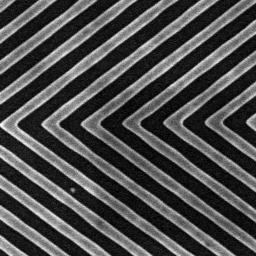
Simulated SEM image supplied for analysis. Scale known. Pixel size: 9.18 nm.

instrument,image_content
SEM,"groups of lines, slits or small figures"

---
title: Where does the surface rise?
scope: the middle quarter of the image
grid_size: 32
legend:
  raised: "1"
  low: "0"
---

00011110000001111000000111100000
01111000000111110000001111000000
11110000001111000000111100000011
11100000011110000001111000000111
10000000111100000011110000001111
00000011110000000111000000111110
00000111100000011110000001111000
00001111000000111100000011110000
00111110000011111000000111100000
01111000000111110000011111000001
11110000001111000000111100000011
11100000011110000001111000000111
11000000111100000111110000011111
00000011110000001111000000111110
00000111100000011110000001111100
00000111100000011110000001111100
00000011111000000111100000011110
11000001111100000011110000001111
11100000011110000001111100000111
11110000001111100000011110000001
01111000000111110000001111000000
00111110000001111000000111110000
00001111000000111110000011111000
00000111100000011111000000111100
00000001111000000111100000011110
11000000111100000011111000000111
11100000011110000001111100000011
11111000001111100000011110000001
01111100000011110000001111100000
00011110000001111000000111110000
00001111100000011110000001111000
00000011110000001111100000111110